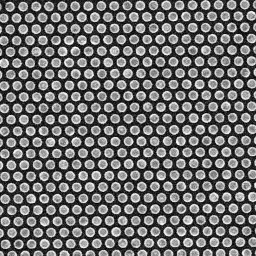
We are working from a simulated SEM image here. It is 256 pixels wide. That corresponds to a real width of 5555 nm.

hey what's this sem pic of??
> a regular array of raised bodies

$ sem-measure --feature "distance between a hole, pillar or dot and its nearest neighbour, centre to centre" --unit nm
275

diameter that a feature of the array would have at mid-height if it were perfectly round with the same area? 0.191 um